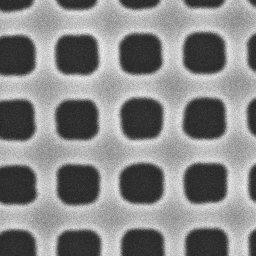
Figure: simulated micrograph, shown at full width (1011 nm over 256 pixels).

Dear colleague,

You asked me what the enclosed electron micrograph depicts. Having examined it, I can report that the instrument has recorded a regular array of holes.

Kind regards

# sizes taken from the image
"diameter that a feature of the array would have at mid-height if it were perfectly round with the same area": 182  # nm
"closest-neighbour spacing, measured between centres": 252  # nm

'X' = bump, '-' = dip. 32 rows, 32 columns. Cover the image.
----XXX-----XXX-----XXX-----XXX-
--XXXXXXXXXXXXXXXXXXXXXXXXXXXXXX
XXXXXXXXXXXXXXXXXXXXXXXXXXXXXXXX
XXXXXXXXXXXXXXXXXXXXXXXXXXXXXXXX
---XXXXX----XXXX----XXX-----XXX-
----XXX-----XXX-----XXX-----XXX-
-----XX-----XXX-----XXX-----XXX-
-----XX------XX-----XXX-----XXX-
----XXX-----XXX-----XXX-----XXX-
---XXXXXXX-XXXXXXXXXXXXXXXXXXXXX
XXXXXXXXXXXXXXXXXXXXXXXXXXXXXXXX
XXXXXXXXXXXXXXXXXXXXXXXXXXXXXXXX
X--XXXXX---XXXXX---XXXXX----XXX-
----XXX-----XXX-----XXX-----XXX-
----XXX-----XXX------XX-----XXX-
----XXX-----XXX-----XXX-----XXX-
----XXX-----XXX-----XXX-----XXX-
----XXXX---XXXXX---XXXXXXXXXXXXX
XXXXXXXXXXXXXXXXXXXXXXXXXXXXXXXX
XXXXXXXXXXXXXXXXXXXXXXXXXXXXXXXX
XXXXXXXXX-XXXXXXX--XXXXX----XXXX
----XXX-----XXX-----XXX-----XXX-
-----XX------XX------XX-----XXX-
-----XX------XX------XX------XX-
-----XX-----XXX-----XXX-----XXX-
----XXXX---XXXXX---XXXXX-XXXXXXX
XXXXXXXXXXXXXXXXXXXXXXXXXXXXXXXX
XXXXXXXXXXXXXXXXXXXXXXXXXXXXXXXX
XXXXXXXXXXXXXXXXXXXXXXXXX--XXXXX
----XXX-----XXX-----XXX-----XXX-
-----XX------XX-----XXX------XX-
-----XX------XX------XX------XX-